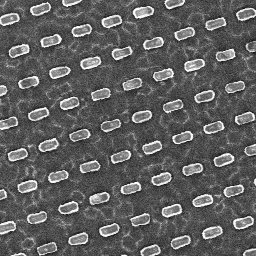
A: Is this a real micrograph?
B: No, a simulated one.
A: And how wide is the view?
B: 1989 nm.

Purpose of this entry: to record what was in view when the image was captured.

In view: a regular array of raised bodies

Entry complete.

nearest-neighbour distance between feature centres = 252 nm